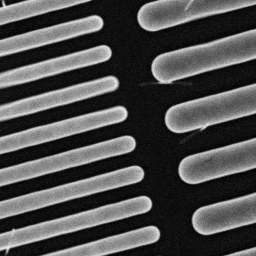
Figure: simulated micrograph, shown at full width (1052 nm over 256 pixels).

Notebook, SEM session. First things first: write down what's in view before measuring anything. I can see groups of lines, slits or small figures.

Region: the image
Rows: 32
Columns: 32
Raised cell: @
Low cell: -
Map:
--@@@@@@@@--------@@@@@@@@@@@@@@
@@@@@@-----------@@@@@@@@@@@----
@@--------@@@----@@@@@@@--------
------@@@@@@------@@@-----------
--@@@@@@@@-------------------@@@
@@@@@@--------------------@@@@@@
@@--------@@@@-------@@@@@@@@@@@
------@@@@@@@------@@@@@@@@@@@@-
---@@@@@@@---------@@@@@@@@-----
@@@@@@-------------@@@@@--------
@@--------@@@@@-----------------
------@@@@@@@---------------@@@@
---@@@@@@@--------------@@@@@@@@
@@@@@@--------@------@@@@@@@@@@@
@@--------@@@@@@-----@@@@@@@@@@-
------@@@@@@@@-------@@@@@@-----
---@@@@@@@------------@---------
@@@@@@@-------@@@--------------@
@@@-------@@@@@@@----------@@@@@
-------@@@@@@@----------@@@@@@@@
---@@@@@@@-------------@@@@@@@@@
@@@@@@@-------@@@@----@@@@@@@@--
@@@--------@@@@@@@-----@@@------
-------@@@@@@@------------------
---@@@@@@@---------------------@
@@@@@@@-------@@@@@--------@@@@@
@@@-------@@@@@@@@------@@@@@@@@
-------@@@@@@@@---------@@@@@@@@
---@@@@@@@@-------@@----@@@@@---
@@@@@@@-------@@@@@@------------
@@@--------@@@@@@@@-------------
-------@@@@@@@@---------------@@